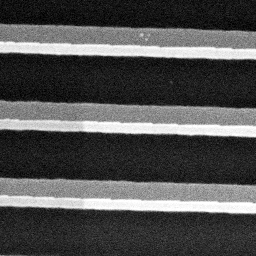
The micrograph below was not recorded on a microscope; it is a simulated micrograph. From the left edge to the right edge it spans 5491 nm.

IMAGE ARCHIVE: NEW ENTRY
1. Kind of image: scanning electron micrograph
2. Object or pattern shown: lines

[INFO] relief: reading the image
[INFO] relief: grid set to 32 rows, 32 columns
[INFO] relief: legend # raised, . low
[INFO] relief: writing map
................................
................................
................................
##############..................
################################
################################
################################
................................
................................
................................
................................
................................
................................
#########################.......
################################
################################
............####################
................................
................................
................................
................................
................................
####............................
################################
################################
################################
............................####
................................
................................
................................
................................
................................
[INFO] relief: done